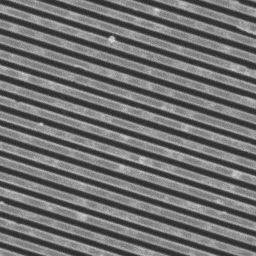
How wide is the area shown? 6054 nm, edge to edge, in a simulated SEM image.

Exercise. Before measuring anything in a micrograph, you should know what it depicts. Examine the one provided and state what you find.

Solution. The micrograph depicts parallel lines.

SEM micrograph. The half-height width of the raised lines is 7.39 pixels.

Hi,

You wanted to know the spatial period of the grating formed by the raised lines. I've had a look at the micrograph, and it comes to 344 nanometres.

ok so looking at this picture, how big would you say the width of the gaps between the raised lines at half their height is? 175 nm